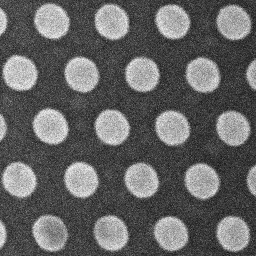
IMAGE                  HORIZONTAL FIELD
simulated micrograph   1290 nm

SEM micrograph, a regular array of raised bodies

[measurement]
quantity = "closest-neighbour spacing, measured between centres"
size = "305 nanometers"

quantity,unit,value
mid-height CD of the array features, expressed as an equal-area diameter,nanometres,169